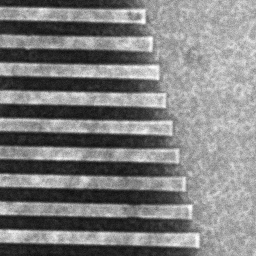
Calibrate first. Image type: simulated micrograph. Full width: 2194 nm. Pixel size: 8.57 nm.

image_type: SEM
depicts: parallel lines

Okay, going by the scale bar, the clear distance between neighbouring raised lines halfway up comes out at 125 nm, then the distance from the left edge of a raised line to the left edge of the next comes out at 239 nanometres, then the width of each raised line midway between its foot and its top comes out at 0.118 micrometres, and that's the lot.